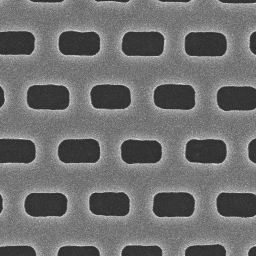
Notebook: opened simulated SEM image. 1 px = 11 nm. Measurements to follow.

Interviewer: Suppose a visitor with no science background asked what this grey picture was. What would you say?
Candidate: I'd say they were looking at a regular array of holes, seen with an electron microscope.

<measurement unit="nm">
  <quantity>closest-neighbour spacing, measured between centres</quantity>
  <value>681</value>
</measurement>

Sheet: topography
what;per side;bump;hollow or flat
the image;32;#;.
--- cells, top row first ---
################################
################################
################################
################################
....###.....###.....###.....###.
....###......##.....###.....###.
....####....###.....###.....####
################################
################################
################################
#####################.##########
###......##.....###.....###.....
.##......##.....###.....###.....
####....####....####....####....
################################
################################
################################
....####....############....####
....###......##.....###.....###.
....###.....###.....###.....###.
################################
################################
################################
################################
###.....###.....###.....###.....
###.....###.....###.....###.....
###.....###.....###.....###.....
################################
################################
################################
################################
....###.....###.....###.....###.